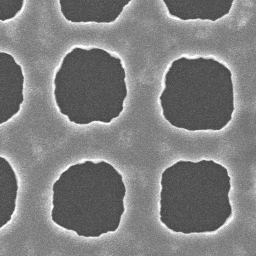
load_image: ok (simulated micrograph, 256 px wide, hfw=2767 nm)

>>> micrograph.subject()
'holes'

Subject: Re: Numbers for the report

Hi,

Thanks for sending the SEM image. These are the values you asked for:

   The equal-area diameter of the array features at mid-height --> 830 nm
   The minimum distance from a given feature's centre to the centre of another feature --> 1130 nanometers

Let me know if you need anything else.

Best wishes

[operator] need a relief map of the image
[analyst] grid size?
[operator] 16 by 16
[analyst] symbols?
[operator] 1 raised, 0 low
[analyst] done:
0111000011000011
1111111111111111
1111111111111111
0111000111111111
0111000011000011
0110000011000001
0111000011000001
0111000111000011
1111111111111111
1111111111111111
0111000111000011
0110000011000011
0110000011000011
0110000011000011
1111100111100111
1111111111111111